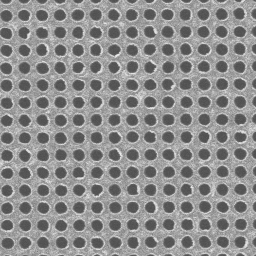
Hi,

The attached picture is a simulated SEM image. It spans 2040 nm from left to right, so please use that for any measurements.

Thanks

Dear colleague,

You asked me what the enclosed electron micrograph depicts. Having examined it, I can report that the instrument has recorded a regular array of holes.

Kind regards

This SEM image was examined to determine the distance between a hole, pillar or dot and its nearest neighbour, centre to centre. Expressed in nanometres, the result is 138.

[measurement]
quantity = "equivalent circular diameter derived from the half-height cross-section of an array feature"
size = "88.1 nm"